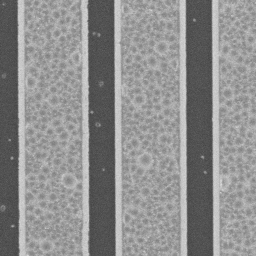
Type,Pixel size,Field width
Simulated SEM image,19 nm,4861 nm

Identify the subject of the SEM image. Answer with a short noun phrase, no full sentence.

one or a few lines or trenches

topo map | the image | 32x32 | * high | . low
...*******.....********....*****
...********....********....*****
...********....********....*****
...********....********....*****
...********....********....*****
...********....********....*****
...********....********....*****
...********....********....*****
...********....********....*****
...********....********....*****
...********....********....*****
...********....********....*****
...********....********....*****
...********....********....*****
...********....********....*****
...********....********....*****
...********....********....*****
...********....********....*****
...********....********....*****
...********....********....*****
...********....********....*****
...********....********....*****
...********....********....*****
...********....********....*****
...********....********....*****
...********....********....*****
...********....********....*****
...********....********....*****
...********....********....*****
...*******.....********....*****
...*******.....********....*****
...********....********....*****